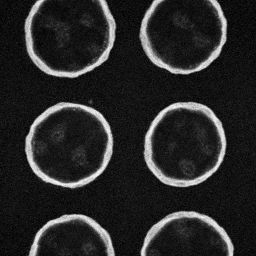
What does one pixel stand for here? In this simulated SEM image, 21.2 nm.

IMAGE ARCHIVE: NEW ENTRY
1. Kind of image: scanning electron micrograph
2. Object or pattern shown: raised bodies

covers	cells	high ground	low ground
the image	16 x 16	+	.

..+++++...++++..
..+++++..+++++..
..+++++..+++++..
..+++++...+++...
...++...........
................
................
..++++....+++...
..+++++..+++++..
..+++++..+++++..
..++++....+++...
....+...........
................
...........+....
...+++....++++..
..+++++..+++++..